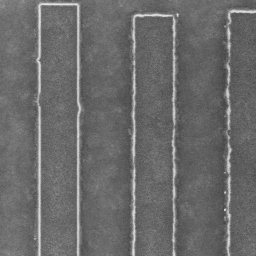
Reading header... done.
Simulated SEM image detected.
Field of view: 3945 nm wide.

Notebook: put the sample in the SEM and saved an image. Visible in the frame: one or a few lines or trenches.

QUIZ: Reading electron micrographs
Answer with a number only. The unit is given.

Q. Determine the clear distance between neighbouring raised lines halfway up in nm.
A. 851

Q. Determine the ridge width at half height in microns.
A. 0.601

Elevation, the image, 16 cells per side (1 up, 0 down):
0001100000000000
0011100011100011
0001100011100011
0011100011100011
0001100011100011
0011100011100011
0011100011100011
0011100011100011
0001100011100011
0001100011100011
0001100011100011
0011100011100011
0011100011100011
0011100011100011
0001100011100011
0001100011100011